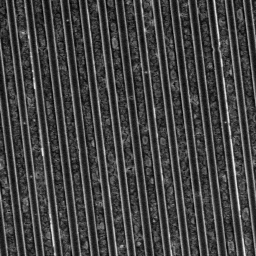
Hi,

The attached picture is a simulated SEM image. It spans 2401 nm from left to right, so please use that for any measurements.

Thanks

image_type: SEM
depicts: parallel lines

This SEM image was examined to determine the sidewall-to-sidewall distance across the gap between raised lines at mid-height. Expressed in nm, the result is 94.3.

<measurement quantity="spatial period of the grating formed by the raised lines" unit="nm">170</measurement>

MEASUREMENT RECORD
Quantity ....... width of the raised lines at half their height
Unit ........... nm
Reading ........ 71